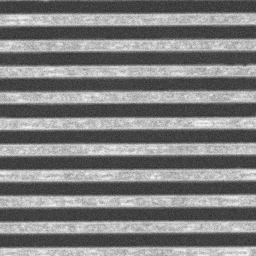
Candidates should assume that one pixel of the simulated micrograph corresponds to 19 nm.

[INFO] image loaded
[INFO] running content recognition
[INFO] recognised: parallel lines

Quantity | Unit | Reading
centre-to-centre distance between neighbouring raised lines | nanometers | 493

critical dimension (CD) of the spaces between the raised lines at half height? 278 nm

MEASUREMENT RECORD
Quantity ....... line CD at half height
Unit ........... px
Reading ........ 11.3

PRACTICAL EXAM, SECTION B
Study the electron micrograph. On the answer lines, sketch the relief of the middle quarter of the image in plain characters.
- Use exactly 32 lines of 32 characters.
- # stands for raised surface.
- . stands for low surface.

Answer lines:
................................
################################
################################
................................
................................
................................
................................
################################
################################
################################
................................
................................
................................
.....................###########
################################
################################
................................
................................
................................
................................
################################
################################
################################
................................
................................
................................
......##########################
################################
################################
................................
................................
................................